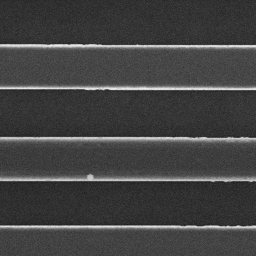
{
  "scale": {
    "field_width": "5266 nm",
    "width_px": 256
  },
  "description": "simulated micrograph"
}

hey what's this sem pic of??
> lines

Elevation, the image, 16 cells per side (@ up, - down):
----------------
----------------
----------------
@@@@@@@@@@@@@@@@
@@@@@@@@@@@@@@@@
@@@@@@@@@@@@@@@@
----------------
----------------
----------------
@@@@@@@@@@@@@@@@
@@@@@@@@@@@@@@@@
----------------
----------------
----------------
@@@@@@@@@@@@@@@@
@@@@@@@@@@@@@@@@